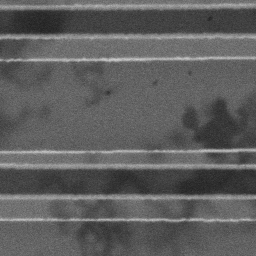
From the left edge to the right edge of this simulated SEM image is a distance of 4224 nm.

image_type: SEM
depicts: lines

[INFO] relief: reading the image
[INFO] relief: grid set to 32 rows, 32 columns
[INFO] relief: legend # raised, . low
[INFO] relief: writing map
################################
................................
................................
................................
................................
################################
################################
####.#..........................
................................
................................
................................
................................
................................
................................
................................
................................
................................
................................
................................
################################
################################
................................
................................
................................
................................
################################
################################
################################
................................
................................
................................
................................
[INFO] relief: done